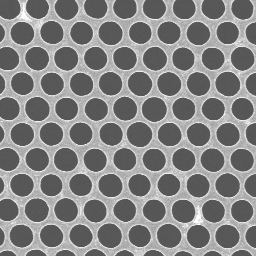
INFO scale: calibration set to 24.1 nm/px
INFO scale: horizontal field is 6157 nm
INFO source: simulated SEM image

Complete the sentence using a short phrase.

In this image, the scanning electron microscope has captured a regular array of holes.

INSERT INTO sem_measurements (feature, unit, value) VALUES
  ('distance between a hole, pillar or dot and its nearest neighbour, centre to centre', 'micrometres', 0.694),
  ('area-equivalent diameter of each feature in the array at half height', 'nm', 562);